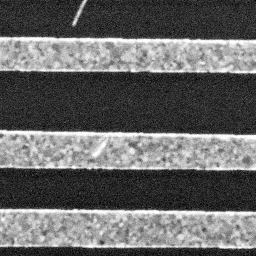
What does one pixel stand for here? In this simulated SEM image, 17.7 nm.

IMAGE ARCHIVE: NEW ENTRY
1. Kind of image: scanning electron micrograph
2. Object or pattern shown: lines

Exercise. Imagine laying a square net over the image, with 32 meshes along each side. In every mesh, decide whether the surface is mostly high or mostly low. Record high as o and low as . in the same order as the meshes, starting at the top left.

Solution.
................................
................................
................................
................................
................................
oooooooooooooooooooooooooooooooo
oooooooooooooooooooooooooooooooo
oooooooooooooooooooooooooooooooo
oooooooooooooooooooooooooooooooo
................................
................................
................................
................................
................................
................................
................................
o...............................
oooooooooooooooooooooooooooooooo
oooooooooooooooooooooooooooooooo
oooooooooooooooooooooooooooooooo
oooooooooooooooooooooooooooooooo
................................
................................
................................
................................
................................
ooooooooooooooooooooo...........
oooooooooooooooooooooooooooooooo
oooooooooooooooooooooooooooooooo
oooooooooooooooooooooooooooooooo
oooooooooooooooooooooooooooooooo
................................